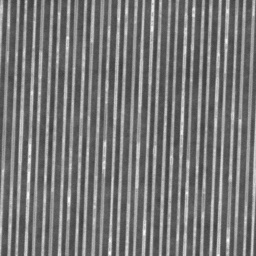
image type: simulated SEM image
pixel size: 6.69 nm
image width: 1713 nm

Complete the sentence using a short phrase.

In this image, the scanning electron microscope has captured parallel lines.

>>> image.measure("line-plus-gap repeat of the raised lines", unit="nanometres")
56.3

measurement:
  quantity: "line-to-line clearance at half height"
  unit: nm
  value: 42.6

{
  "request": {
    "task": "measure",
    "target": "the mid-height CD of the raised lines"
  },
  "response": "12.5 nm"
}